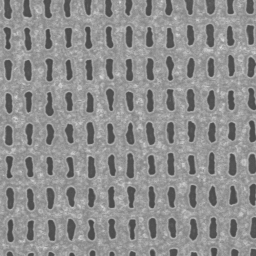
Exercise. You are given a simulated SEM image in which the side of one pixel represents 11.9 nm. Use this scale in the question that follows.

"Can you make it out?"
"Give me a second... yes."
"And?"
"a regular array of holes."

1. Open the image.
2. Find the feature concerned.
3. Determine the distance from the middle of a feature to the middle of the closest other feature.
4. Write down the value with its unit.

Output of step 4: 20.1 pixels